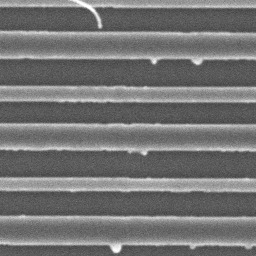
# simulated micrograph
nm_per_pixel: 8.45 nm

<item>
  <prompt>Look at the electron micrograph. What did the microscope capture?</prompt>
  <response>lines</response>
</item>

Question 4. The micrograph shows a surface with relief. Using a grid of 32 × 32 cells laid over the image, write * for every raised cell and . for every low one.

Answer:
********************************
................................
................................
................................
********************************
********************************
********************************
...................*....**......
................................
................................
................................
********************************
********************************
................................
................................
................................
********************************
********************************
********************************
................................
................................
................................
********************************
********************************
................................
................................
................................
********************************
********************************
********************************
.*******************************
..............*.................